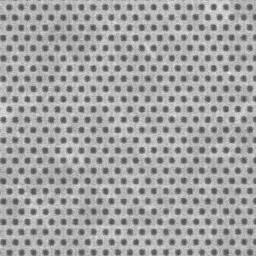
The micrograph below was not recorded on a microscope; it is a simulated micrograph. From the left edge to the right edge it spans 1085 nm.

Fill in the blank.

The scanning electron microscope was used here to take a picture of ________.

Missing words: a regular array of holes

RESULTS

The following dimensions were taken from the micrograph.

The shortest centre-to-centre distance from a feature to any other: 48.8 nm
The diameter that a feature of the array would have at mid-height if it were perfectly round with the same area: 0.031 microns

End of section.